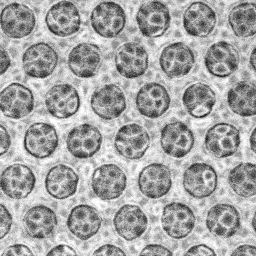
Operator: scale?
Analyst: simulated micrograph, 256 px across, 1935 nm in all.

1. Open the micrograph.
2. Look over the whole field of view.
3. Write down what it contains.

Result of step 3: a regular array of holes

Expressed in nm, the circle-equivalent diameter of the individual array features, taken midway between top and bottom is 267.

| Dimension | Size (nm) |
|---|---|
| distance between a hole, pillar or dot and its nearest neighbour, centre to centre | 338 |